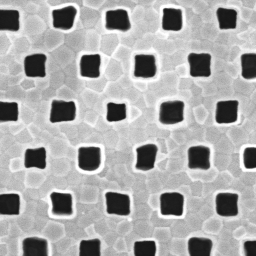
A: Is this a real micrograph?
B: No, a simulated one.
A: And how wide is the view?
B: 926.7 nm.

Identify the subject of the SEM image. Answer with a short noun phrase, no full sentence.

a regular array of holes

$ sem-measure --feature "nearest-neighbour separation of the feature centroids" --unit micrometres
0.192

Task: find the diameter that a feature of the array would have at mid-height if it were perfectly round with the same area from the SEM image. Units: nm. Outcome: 84.1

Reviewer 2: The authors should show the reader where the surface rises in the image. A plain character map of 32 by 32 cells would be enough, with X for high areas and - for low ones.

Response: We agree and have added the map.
XXXXXXXXXXXXXXXXXXXXXXXXXXXXXXXX
--XXXXX--XXXXX--XXXX--XXXXX--XXX
--XXXXX--XXXX---XXXX---XXXX---XX
--XXXXXXXXXXXX--XXXXX--XXXXX-XXX
XXXXXXXXXXXXXXXXXXXXXXXXXXXXXXXX
XXXXXXXXXXXXXXXXXXXXXXXXXXXXXXXX
XXXXXXXXXXXXXXXXXXXXXXXXXXXXXXXX
XXX---XXXX---XXXX--XXXXX--XXXX--
XXX---XXXX---XXXX--XXXXX--XXXX--
XXXX-XXXXXX-XXXXX--XXXXX--XXXX--
XXXXXXXXXXXXXXXXXXXXXXXXXXXXXXXX
XXXXXXXXXXXXXXXXXXXXXXXXXXXXXXXX
XXXXXXXXXXXXXXXXXXXXXXXXXXXXXXXX
--XXXX---XXXX---XXXX---XXXX---XX
--XXXX---XXXX---XXXX---XXXX---XX
XXXXXXXXXXXXXXXXXXXXXXXXXXXXXXXX
XXXXXXXXXXXXXXXXXXXXXXXXXXXXXXXX
XXXXXXXXXXXXXXXXXXXXXXXXXXXXXXXX
XXXXXXXXXX--XXXXX--XXXXX--XXXXX-
XXX---XXXX--XXXXX--XXXXX--XXXX--
XXX---XXXX--XXXXX--XXXXX--XXXX--
XXXXXXXXXXXXXXXXXXXXXXXXXXXXXXXX
XXXXXXXXXXXXXXXXXXXXXXXXXXXXXXXX
XXXXXXXXXXXXXXXXXXXXXXXXXXXXXXXX
--XXXX---XXXX---XXXX---XXXX---XX
--XXXX---XXXX---XXXX---XXXX---XX
--XXXXX--XXXXX--XXXX---XXXX---XX
XXXXXXXXXXXXXXXXXXXXXXXXXXXXXXXX
XXXXXXXXXXXXXXXXXXXXXXXXXXXXXXXX
XXXXXXXXXXXXXXXXXXXXXXXXXXXXXXXX
XXX---XXXX--XXXXX--XXXX---XXXXX-
XXX---XXXX--XXXXX--XXXXX--XXXXX-